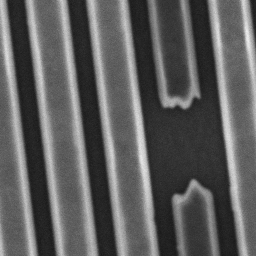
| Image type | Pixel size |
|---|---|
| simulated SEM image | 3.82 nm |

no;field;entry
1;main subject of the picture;parallel lines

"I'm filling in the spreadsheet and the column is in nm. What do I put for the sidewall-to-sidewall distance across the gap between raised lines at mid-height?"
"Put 96.3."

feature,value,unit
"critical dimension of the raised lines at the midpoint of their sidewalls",137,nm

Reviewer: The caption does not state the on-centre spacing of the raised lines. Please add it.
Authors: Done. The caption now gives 232 nm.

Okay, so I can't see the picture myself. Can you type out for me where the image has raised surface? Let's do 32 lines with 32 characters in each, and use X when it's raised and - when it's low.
----XXXX---XXXXX---XXXX---XXXXX-
X---XXXX---XXXXX---XXXX----XXXX-
X---XXXX----XXXX---XXXX----XXXX-
X---XXXX----XXXX---XXXXX---XXXX-
X---XXXXX---XXXX---XXXXX---XXXX-
X---XXXXX---XXXX---XXXXX---XXXXX
X---XXXXX---XXXX----XXXX---XXXXX
X---XXXXX---XXXX----XXXX---XXXXX
X----XXXX---XXXXX---XXXX---XXXXX
XX---XXXX---XXXXX---XXXX----XXXX
XX---XXXX---XXXXX---XXXX----XXXX
XX---XXXX----XXXX---XXXX----XXXX
XX---XXXXX---XXXX---XXXX----XXXX
XX---XXXXX---XXXX-----------XXXX
XX---XXXXX---XXXX-----------XXXX
XX---XXXXX---XXXX-----------XXXX
XX----XXXX---XXXXX----------XXXX
XXX---XXXX---XXXXX----------XXXX
XXX---XXXX---XXXXX-----------XXX
XXX---XXXX----XXXX-----------XXX
XXX---XXXXX---XXXX-----------XXX
XXX---XXXXX---XXXX-----------XXX
XXX---XXXXX---XXXX-----------XXX
XXX---XXXXX---XXXX------X----XXX
XXX----XXXX---XXXXX----XXX---XXX
XXXX---XXXX---XXXXX---XXXX---XXX
XXXX---XXXX---XXXXX---XXXX----XX
XXXX---XXXX----XXXX---XXXXX---XX
XXXX---XXXX----XXXX---XXXXX---XX
XXXX---XXXXX---XXXX---XXXXX---XX
XXXX---XXXXX---XXXX---XXXXX---XX
XXXX---XXXXX---XXXX----XXXX---XX